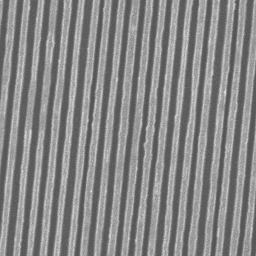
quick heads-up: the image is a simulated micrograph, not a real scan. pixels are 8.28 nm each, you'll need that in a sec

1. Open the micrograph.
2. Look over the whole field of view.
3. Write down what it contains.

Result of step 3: parallel lines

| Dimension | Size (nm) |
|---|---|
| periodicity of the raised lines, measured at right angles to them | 112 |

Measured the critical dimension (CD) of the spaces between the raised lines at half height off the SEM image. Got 56.6 nanometers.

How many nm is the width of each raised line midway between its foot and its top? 56.6